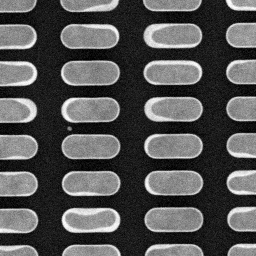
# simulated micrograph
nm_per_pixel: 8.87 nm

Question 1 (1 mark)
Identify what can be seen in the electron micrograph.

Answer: groups of lines, slits or small figures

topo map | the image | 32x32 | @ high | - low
@@@@----@@@@@@----@@@@@@@----@@@
--------------------------------
--------------------------------
@@@@----@@@@@@-----@@@@@@----@@@
@@@@----@@@@@@@---@@@@@@@---@@@@
@@@@----@@@@@@-----@@@@@@----@@@
--------------------------------
--------------------------------
@@@@----@@@@@@@---@@@@@@@----@@@
@@@@----@@@@@@@---@@@@@@@---@@@@
@@-------@@@@@------------------
--------------------------------
@@@------@@@@@-----@@@@@@----@@@
@@@@----@@@@@@@---@@@@@@@---@@@@
@@@@----@@@@@@@----@@@@@@----@@@
--------------------------------
--------------------------------
@@@@----@@@@@@@---@@@@@@@----@@@
@@@@@---@@@@@@@---@@@@@@@---@@@@
@@@@----@@@@@@-----@@@@@@------@
--------------------------------
-------------------@@@@@-------@
@@@@@---@@@@@@@---@@@@@@@---@@@@
@@@@@---@@@@@@@---@@@@@@@----@@@
--------------------------------
--------------------------------
@@@@----@@@@@@-----@@@@@@----@@@
@@@@@---@@@@@@@---@@@@@@@----@@@
@@@@----@@@@@@-----@@@@@@----@@@
--------------------------------
--------------------------------
@@@@@---@@@@@@@---@@@@@@@----@@@